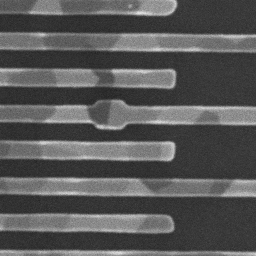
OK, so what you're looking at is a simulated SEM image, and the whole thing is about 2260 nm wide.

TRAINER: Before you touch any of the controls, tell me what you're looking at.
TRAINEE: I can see wiring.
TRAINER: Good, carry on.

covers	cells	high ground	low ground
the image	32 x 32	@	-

@@@@@@@@@@@@@@@@@@@@@@----------
@@@@@@@@@@@@@@@@@@@@@@----------
--------------------------------
--------------------------------
@@@@@@@@@@@@@@@@@@@@@@@@@@@@----
@@@@@@@@@@@@@@@@@@@@@@@@@@@@@@@@
--------------------------------
--------------------------------
--------------------------------
@@@@@@@@@@@@@@@@@@@@@@----------
@@@@@@@@@@@@@@@@@@@@@@----------
--------------------------------
--------------------------------
@@@@@@@@@@@@@@@@@@@@@@@@@@@@@@@@
@@@@@@@@@@@@@@@@@@@@@@@@@@@@@@@@
------------@@@@----------------
--------------------------------
--------------------------------
@@@@@@@@@@@@@@@@@@@@@@----------
@@@@@@@@@@@@@@@@@@@@@@----------
--------------------------------
--------------------------------
@@@@@@@@@@@@@@@@@@@@@@@---------
@@@@@@@@@@@@@@@@@@@@@@@@@@@@@@@@
-------------------------------@
--------------------------------
--------------------------------
@@@@@@@@@@@@@@@@@@@@@@----------
@@@@@@@@@@@@@@@@@@@@@@----------
--------------------------------
--------------------------------
@@@@@@@@@@@@@@@@@@@@@@@@@@@@----